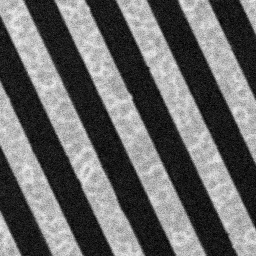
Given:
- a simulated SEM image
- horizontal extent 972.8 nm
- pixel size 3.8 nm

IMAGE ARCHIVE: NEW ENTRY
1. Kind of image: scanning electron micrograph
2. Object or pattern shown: parallel lines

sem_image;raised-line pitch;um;0.212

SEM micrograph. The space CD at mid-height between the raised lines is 27.8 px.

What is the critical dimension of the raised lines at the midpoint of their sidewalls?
106 nanometers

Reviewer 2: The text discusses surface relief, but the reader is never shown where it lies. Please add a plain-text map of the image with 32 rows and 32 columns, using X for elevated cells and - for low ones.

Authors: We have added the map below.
XXX----XXXX----XXXX---XXXX----XX
XXXX---XXXX----XXXX----XXXX----X
XXXX----XXXX----XXX----XXXX----X
-XXXX---XXXX----XXXX----XXXX----
-XXXX----XXXX----XXX----XXXX----
--XXXX---XXXX----XXXX----XXXX---
--XXXX----XXXX----XXX----XXXX---
---XXX----XXXX----XXXX----XXXX--
---XXXX----XXXX----XXX----XXXX--
----XXX----XXXX----XXXX----XXXX-
----XXXX----XXXX---XXXX----XXXX-
X----XXX----XXXX----XXXX----XXX-
X----XXXX----XXXX---XXXX----XXXX
XX----XXX----XXXX----XXXX----XXX
XX----XXXX----XXX----XXXX----XXX
XXX---XXXX----XXXX----XXXX----XX
XXX----XXXX----XXX----XXXX----XX
XXXX---XXXX----XXXX----XXXX---XX
XXXX----XXXX----XXX----XXXX----X
-XXX----XXXX----XXXX----XXXX---X
-XXXX----XXXX----XXX----XXXX----
--XXX----XXXX----XXXX----XXX----
--XXXX----XXXX---XXXX----XXXX---
---XXX----XXXX----XXXX----XXX---
---XXXX----XXXX---XXXX----XXXX--
----XXX----XXXX----XXXX----XXX--
----XXXX----XXX----XXXX----XXXX-
X---XXXX----XXXX----XXXX----XXX-
X----XXXX----XXX----XXXX----XXXX
XX---XXXX----XXXX----XXXX----XXX
XX----XXXX----XXX----XXXX----XXX
XX----XXXX----XXXX----XXXX---XXX